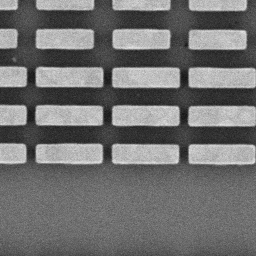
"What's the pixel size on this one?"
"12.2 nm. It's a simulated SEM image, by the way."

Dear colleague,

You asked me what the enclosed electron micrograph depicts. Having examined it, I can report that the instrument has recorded wiring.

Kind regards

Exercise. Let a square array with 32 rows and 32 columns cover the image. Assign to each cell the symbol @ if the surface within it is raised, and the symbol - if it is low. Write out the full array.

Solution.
@@---@@@@@@@--@@@@@@@---@@@@@@@-
--------------------------------
--------------------------------
--------------------------------
@@---@@@@@@@--@@@@@@@---@@@@@@@-
@@---@@@@@@@--@@@@@@@---@@@@@@@-
--------------------------------
--------------------------------
@@@--@--------------------------
@@@--@@@@@@@@-@@@@@@@@--@@@@@@@@
@@@--@@@@@@@@-@@@@@@@@--@@@@@@@@
--------------------------------
--------------------------------
@@@--@@@@@@@@-@@@@@@@@--@@@@@@@@
@@@-@@@@@@@@@-@@@@@@@@--@@@@@@@@
@@@--@@@@@@@@-@@@@@@@@--@@@@@@@@
--------------------------------
--------------------------------
@@@--@@@@@@@@-@@@@@@@@--@@@@@@@@
@@@--@@@@@@@@-@@@@@@@@--@@@@@@@@
--------------------------------
--------------------------------
--------------------------------
--------------------------------
--------------------------------
--------------------------------
--------------------------------
--------------------------------
--------------------------------
--------------------------------
--------------------------------
--------------------------------